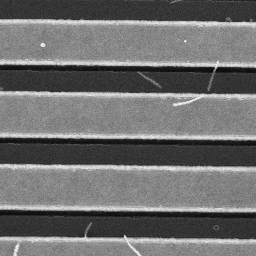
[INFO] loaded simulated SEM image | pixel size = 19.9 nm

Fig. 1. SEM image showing lines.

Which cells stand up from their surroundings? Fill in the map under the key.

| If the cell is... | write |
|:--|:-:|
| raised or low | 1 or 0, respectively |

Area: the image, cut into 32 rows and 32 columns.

00000000000000000000000000000000
00000000000000000000000000000000
11111111101000000000000000000000
11111111111111111111111111111111
11111111111111111111111111111111
11111111111111111111111111111111
11111111111111111111111111111111
11111111111111111111111111111111
00000000000000000000000000000000
00000000000000000000000000000000
00000000000000000000000000000000
11111110000000000000000000000000
11111111111111111111111111111111
11111111111111111111111111111111
11111111111111111111111111111111
11111111111111111111111111111111
11111111111111111111111111111111
00000000000000000000000000000111
00000000000000000000000000000000
00000000000000000000000000000000
00000000000000000000000000000000
11111111111111111111111111111111
11111111111111111111111111111111
11111111111111111111111111111111
11111111111111111111111111111111
11111111111111111111111111111111
00000000000000000000000000000000
00000000000000000000000000000000
00000000000000000000000000000000
00000000000000000000000000000000
11111111111111111111111111111111
11111111111111111111111111111111